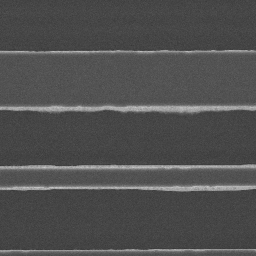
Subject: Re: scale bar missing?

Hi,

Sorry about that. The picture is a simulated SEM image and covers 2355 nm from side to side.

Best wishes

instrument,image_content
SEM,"lines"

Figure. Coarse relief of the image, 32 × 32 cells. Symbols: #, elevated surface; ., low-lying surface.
................................
................................
................................
................................
................................
................................
..#...##.#######################
################################
################################
################################
################################
################################
################################
########..###..#.#....###.......
................................
................................
................................
................................
................................
................................
................................
################################
################################
................................
................................
................................
................................
................................
................................
................................
................................
################################